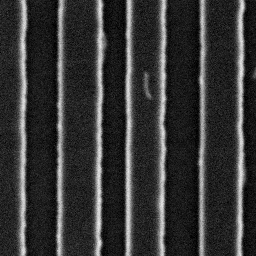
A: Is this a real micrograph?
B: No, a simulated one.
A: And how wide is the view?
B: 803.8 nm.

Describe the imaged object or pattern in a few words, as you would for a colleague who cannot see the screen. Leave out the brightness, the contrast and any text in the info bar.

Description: lines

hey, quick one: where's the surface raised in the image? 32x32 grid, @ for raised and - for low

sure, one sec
@@@-----@@@@@---@@@@@----@@@@@--
@@@----@@@@@@---@@@@@----@@@@@--
@@@----@@@@@@---@@@@@----@@@@@--
@@@----@@@@@@---@@@@@----@@@@@--
@@@----@@@@@@---@@@@@----@@@@@--
@@@----@@@@@@---@@@@@----@@@@@--
@@@----@@@@@@---@@@@@----@@@@@--
@@@----@@@@@@---@@@@@----@@@@@--
@@@----@@@@@@---@@@@@----@@@@@--
@@@----@@@@@@---@@@@@----@@@@@--
@@@----@@@@@@---@@@@@----@@@@@--
@@@----@@@@@@---@@@@@----@@@@@--
@@@----@@@@@@---@@@@@----@@@@@--
@@@----@@@@@@---@@@@@----@@@@@--
@@@----@@@@@@---@@@@-----@@@@@--
@@@----@@@@@@---@@@@-----@@@@@--
@@@----@@@@@@---@@@@@----@@@@@--
@@@----@@@@@@---@@@@@----@@@@@--
@@@----@@@@@@---@@@@@----@@@@@--
@@@----@@@@@@---@@@@@----@@@@@--
@@@----@@@@@----@@@@-----@@@@@--
@@@----@@@@@----@@@@@----@@@@@--
@@@----@@@@@----@@@@@----@@@@@--
@@@----@@@@@----@@@@-----@@@@@--
@@@----@@@@@----@@@@-----@@@@@--
@@@----@@@@@----@@@@-----@@@@@--
@@@----@@@@@----@@@@-----@@@@@--
@@@----@@@@@----@@@@-----@@@@@--
@@@----@@@@@----@@@@-----@@@@@--
@@@----@@@@@----@@@@-----@@@@@--
@@@----@@@@@@---@@@@-----@@@@@--
@@@----@@@@@----@@@@-----@@@@@--